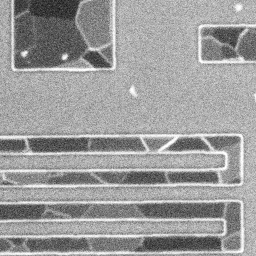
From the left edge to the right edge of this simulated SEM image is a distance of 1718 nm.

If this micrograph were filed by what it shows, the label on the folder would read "wiring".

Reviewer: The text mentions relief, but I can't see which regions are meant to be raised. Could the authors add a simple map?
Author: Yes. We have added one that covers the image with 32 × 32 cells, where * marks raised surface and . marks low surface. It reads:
..************..................
..************..................
..************..................
..************...........*******
..************...........*******
..************...........*******
..************...........*******
..************...........*******
..************..................
................................
................................
................................
................................
................................
................................
................................
................................
******************************..
******************************..
............................**..
............................**..
******************************..
******************************..
................................
................................
******************************..
******************************..
*********..................***..
............................**..
......************************..
******************************..
******************************..